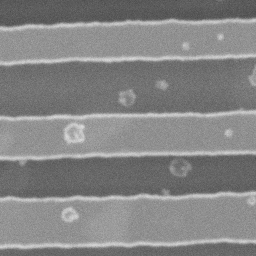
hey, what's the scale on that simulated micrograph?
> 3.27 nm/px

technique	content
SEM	lines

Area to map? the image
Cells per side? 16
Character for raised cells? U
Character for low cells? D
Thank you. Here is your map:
DDDDDDDDDDDDDDDD
DDDDUUUUUUUUUUUU
UUUUUUUUUUUUUUUU
UUUUUUUUUUUUUUUU
DDDDDDDDDDDDDDDD
DDDDDDDDDDDDDDDD
DDDDDDDDDDDDDDDD
UUUUUUUUUUUUUUUU
UUUUUUUUUUUUUUUU
UUUUUUUUUUUUUUUU
DDDDDDDDDDDDDDDD
DDDDDDDDDDDDDDDD
UUUUUUUUUUUUUUUU
UUUUUUUUUUUUUUUU
UUUUUUUUUUUUUUUU
UUDDDDDDDDDDDDDD